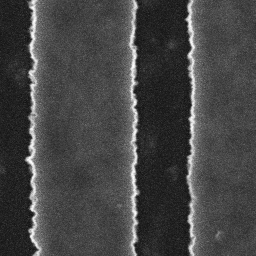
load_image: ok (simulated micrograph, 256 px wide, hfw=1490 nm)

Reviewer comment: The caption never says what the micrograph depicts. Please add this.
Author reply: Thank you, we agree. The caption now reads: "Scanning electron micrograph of one or a few lines or trenches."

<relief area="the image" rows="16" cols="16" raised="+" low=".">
..++++++....++++
..++++++....++++
..++++++....++++
..++++++....++++
..++++++....++++
..++++++....++++
..++++++....++++
..++++++....++++
..++++++....++++
..++++++....++++
..++++++....++++
..++++++....++++
..++++++....++++
..++++++....++++
..++++++....++++
..++++++....++++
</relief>